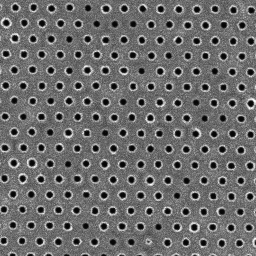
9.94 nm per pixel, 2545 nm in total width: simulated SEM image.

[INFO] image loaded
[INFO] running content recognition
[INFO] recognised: a regular array of holes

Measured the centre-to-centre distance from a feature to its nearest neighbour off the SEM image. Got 175 nm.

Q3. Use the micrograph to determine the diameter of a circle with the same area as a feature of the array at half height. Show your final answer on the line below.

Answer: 64.4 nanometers